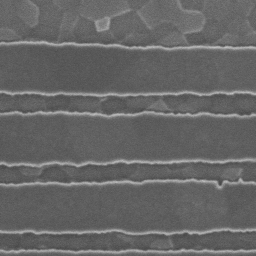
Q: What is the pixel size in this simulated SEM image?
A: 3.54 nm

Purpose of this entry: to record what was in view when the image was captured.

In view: one or a few lines or trenches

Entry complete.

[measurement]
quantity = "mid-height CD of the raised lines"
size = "49.4 px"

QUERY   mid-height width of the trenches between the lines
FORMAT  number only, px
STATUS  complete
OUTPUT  19.1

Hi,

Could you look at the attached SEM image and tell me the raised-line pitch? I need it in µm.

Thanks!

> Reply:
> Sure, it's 0.243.